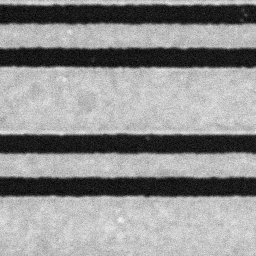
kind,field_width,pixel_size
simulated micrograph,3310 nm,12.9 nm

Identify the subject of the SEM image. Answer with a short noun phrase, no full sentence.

lines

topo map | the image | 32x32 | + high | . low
................................
................................
................................
++++++++++++++++++++++++++++++++
++++++++++++++++++++++++++++++++
++++++++++++++++++++++++++++++++
................................
................................
+++++++++++++.++.+++....++..+.+.
++++++++++++++++++++++++++++++++
++++++++++++++++++++++++++++++++
++++++++++++++++++++++++++++++++
++++++++++++++++++++++++++++++++
++++++++++++++++++++++++++++++++
++++++++++++++++++++++++++++++++
++++++++++++++++++++++++++++++++
++++++++++++++++++++++++++++++++
................................
................................
++++++++++++++++++++++++++++++++
++++++++++++++++++++++++++++++++
++++++++++++++++++++++++++++++++
................................
................................
................................
++++++++++++++++++++++++++++++++
++++++++++++++++++++++++++++++++
++++++++++++++++++++++++++++++++
++++++++++++++++++++++++++++++++
++++++++++++++++++++++++++++++++
++++++++++++++++++++++++++++++++
++++++++++++++++++++++++++++++++